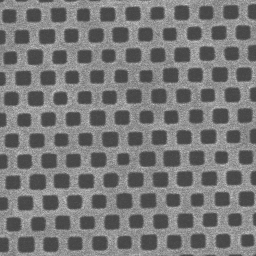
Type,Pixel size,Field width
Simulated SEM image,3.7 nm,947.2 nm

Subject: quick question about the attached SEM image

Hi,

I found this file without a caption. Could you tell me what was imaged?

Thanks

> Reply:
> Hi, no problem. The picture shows a regular array of holes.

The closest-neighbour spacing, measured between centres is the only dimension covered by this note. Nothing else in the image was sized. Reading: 0.0882 µm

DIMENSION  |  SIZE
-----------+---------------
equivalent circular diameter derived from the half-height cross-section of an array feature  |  60.8 nm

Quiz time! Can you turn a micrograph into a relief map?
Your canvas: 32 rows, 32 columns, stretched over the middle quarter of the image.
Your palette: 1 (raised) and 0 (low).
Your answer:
11111111111111111111111111111111
11111110011110001110001110000110
00001100001100001110001100000110
00001100001100001110001100000110
00001110001110001110001110001111
11111111111111111111111111111111
11111111110001110001110001110001
01110001100001100001110000110000
01100001100001100001110000110000
01100001110001110001110001110001
11111111111111111111111111111111
11111110001111111111011111111111
00001100000110000110001110000110
00001100000100000110000110000110
00001100000100001110001110000110
10011110001111111111111111111111
11111111111111111111111101111001
01110001110001110001110000110000
01110001100000110000110000110000
01110001100000110000110000110000
01110011110001111011111111111111
11111111111111111111111111111111
10001110000111001110000110000110
00001100000110000110000110000110
00001100000110001110000110000110
10001110001111111110000110000111
11111111111111111111111111111111
01110001110001110000110000110000
01110000110000110000110000110000
01110000110000110000110000110000
01110001110001110000110000111000
11111111111111111111111111111111